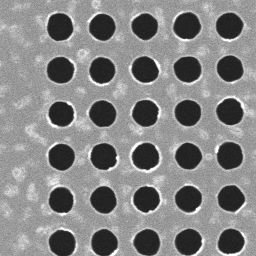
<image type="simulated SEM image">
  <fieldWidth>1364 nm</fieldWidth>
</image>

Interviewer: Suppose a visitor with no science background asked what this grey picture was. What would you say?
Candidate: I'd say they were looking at a regular array of holes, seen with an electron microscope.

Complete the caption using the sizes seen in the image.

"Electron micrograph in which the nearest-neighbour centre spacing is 0.225 micrometres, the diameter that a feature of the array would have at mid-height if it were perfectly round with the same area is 26.3 px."